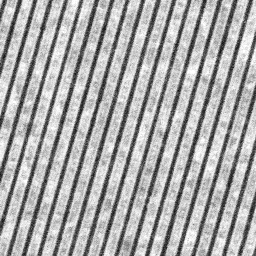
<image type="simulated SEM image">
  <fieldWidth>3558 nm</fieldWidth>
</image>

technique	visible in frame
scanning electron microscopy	parallel lines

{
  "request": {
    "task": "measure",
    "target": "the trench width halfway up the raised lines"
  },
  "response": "86.9 nm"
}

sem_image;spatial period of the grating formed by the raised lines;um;0.206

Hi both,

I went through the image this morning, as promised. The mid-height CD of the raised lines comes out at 114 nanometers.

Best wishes